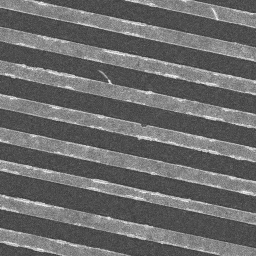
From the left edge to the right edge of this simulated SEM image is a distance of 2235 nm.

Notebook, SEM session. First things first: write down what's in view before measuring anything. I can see parallel lines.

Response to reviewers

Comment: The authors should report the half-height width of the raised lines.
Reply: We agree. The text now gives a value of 0.116 microns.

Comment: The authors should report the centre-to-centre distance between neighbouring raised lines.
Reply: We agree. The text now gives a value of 0.286 um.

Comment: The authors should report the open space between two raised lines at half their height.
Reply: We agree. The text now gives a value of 166 nanometres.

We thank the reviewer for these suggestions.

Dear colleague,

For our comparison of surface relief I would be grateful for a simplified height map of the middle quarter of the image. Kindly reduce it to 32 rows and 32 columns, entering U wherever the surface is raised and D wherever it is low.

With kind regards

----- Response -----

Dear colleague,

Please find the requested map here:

DDDDDDDDDDDDDDUUUUUUUUUUUUUUUUDD
DDDDDDDDDDDDDDDDDDDUUUUUUUUUUUUU
UDDDDDDDDDDDDDDDDDDDDDDUUUUUUUUU
UUUUUDDDDDDDDDDDDDDDDDDDDDDUUUUU
UUUUUUUUUUDDDDDDDDDDDDDDDDDDDDDD
UUUUUUUUUUUUUUDDDDDDDDDDDDDDDDDD
DDDUUUUUUUUUUUUUUUDDDDDDDDDDDDDD
DDDDDDDUUUUUUUUUUUUUUUUUDDDDDDDD
DDDDDDDDDDDDUUUUUUUUUUUUUUUUDDDD
DDDDDDDDDDDDDDDDDUUUUUUUUUUUUUUU
DDDDDDDDDDDDDDDDDDDDDDUUUUUUUUUU
UUDDDDDDDDDDDDDDDDDDDDDDDDUUUUUU
UUUUUUUDDDDDDDDDDDDDDDDDDDDDDDDU
UUUUUUUUUUUUDDDDDDDDDDDDDDDDDDDD
DUUUUUUUUUUUUUUUDDDDDDDDDDDDDDDD
DDDDDUUUUUUUUUUUUUUDDDDDDDDDDDDD
DDDDDDDDDDUUUUUUUUUUUUUUUUDDDDDD
DDDDDDDDDDDDDDDUUUUUUUUUUUUUUUUD
DDDDDDDDDDDDDDDDDDUUUUUUUUUUUUUU
DDDDDDDDDDDDDDDDDDDDDDDDUUUUUUUU
UUUUUUDDDDDDDDDDDDDDDDDDDDDDDUUU
UUUUUUUUUUUDDDDDDDDDDDDDDDDDDDDD
UUUUUUUUUUUUUUUDDDDDDDDDDDDDDDDD
DDDDUUUUUUUUUUUUUUUDDDDDDDDDDDDD
DDDDDDDDUUUUUUUUUUUUUUUUDDDDDDDD
DDDDDDDDDDDDDUUUUUUUUUUUUUUUUDDD
DDDDDDDDDDDDDDDDDDUUUUUUUUUUUUUU
DDDDDDDDDDDDDDDDDDDDDDUUUUUUUUUU
UUUUUDDDDDDDDDDDDDDDDDDDDDDUUUUU
UUUUUUUUUUUDDDDDDDDDDDDDDDDDDDDD
DDDUUUUUUUUUUUUDDDDDDDDDDDDDDDDD
DDDDDDDDUUUUUUUUUUUDDDDDDDDDDDDD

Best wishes